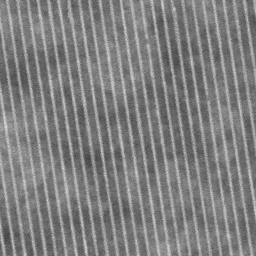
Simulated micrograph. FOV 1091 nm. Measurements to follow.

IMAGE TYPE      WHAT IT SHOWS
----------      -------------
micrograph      parallel lines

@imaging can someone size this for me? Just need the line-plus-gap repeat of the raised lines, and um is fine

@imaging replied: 0.0434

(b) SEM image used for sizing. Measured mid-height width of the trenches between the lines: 0.0363 µm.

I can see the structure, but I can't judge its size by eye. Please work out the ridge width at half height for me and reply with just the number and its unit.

6.8 nm